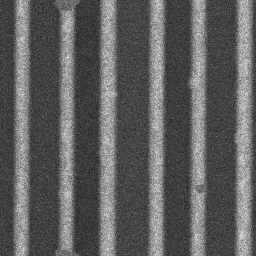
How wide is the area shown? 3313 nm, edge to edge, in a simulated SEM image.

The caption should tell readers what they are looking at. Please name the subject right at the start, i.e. parallel lines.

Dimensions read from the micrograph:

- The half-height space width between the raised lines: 408 nm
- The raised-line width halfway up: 186 nm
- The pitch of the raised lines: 575 nm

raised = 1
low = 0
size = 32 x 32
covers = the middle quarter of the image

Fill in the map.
11000000011110000000001110000000
11000000011110000000001110000000
11000000011110000000001110000000
11000000011110000000001110000000
11000000011110000000001110000001
11000000011110000000001110000001
11000000011110000000001110000000
11000000011110000000001110000000
11000000011110000000001110000000
11000000011110000000001110000000
11000000011110000000001110000000
11000000011110000000001110000000
11000000011110000000001110000000
11000000011110000000001110000000
11000000011110000000001110000000
11000000011110000000001110000000
11000000011110000000011110000000
11000000011110000000011110000000
11000000011110000000011110000000
11000000011110000000011110000000
11000000011110000000011110000000
11000000011110000000011110000000
11000000011110000000011110000000
11000000011110000000011110000000
11000000011110000000011110000000
11000000011110000000011110000000
11000000011110000000011110000000
11000000011110000000011110000000
11000000011110000000011110000000
11000000011110000000001110000000
11000000011110000000001110000000
11000000011110000000001110000000